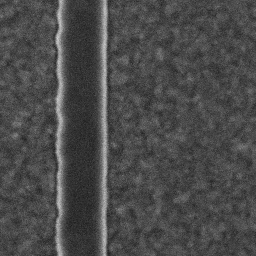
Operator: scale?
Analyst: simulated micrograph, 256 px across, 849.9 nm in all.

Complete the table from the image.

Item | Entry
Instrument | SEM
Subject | one or a few lines or trenches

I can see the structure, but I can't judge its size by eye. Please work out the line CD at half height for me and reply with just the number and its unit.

158 nanometres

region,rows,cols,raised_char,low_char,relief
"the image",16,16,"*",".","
....***.........
....***.........
....***.........
....***.........
....***.........
....***.........
....***.........
....***.........
....***.........
....***.........
....***.........
....***.........
....***.........
....***.........
....***.........
....***.........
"